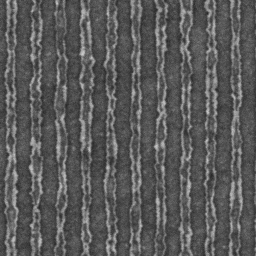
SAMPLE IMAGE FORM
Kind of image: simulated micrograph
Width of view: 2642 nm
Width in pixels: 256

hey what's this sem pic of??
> parallel lines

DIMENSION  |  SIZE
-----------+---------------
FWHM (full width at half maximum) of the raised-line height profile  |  87.8 nanometres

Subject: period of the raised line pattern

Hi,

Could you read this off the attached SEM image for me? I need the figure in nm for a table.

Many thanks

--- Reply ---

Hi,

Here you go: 258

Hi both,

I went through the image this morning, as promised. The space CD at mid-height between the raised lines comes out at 168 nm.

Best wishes